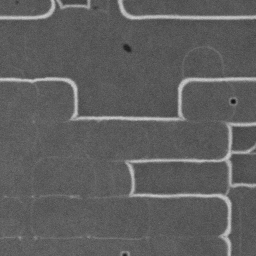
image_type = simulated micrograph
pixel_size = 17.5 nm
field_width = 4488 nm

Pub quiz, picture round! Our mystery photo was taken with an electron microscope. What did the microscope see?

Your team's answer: wiring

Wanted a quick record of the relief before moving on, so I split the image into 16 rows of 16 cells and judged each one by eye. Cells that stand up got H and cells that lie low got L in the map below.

HHHLLLLLHHHHHHHH
LLLLLLLLLLLLLLLL
LLLLLLLLLLLLLLLL
LLLLLLLLLLLLLLLL
LLLLLLLLLLLLLLLL
HHHHHLLLLLLHHHHH
HHHHHLLLLLLHHHHH
HHHHHHHHHHHHHHHH
HHHHHHHHHHHHHHLL
HHHHHHHHHHHHHHLL
HHHHHHHHLLLLLLLL
HHHHHHHHLLLLLLLL
HHHHHHHHHHHHHHLL
HHHHHHHHHHHHHHLL
HHHHHHHHHHHHHHLL
HHHHHHHHHHHHHHLL